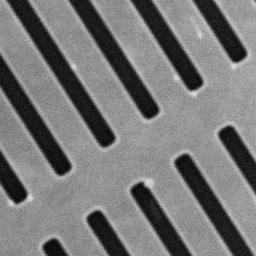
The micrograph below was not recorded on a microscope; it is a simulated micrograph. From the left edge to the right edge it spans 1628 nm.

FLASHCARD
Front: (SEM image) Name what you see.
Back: groups of lines, slits or small figures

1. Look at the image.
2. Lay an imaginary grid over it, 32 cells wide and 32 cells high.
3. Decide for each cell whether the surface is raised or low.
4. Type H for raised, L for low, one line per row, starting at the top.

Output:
HLLLHHHHHLLLHHHHLLLHHHHHLLLHHHHH
HHLLLHHHHLLLHHHHHLLLHHHHHLLLHHHH
HHLLLHHHHHLLLHHHHHLLLHHHHHLLHHHH
HHHLLLHHHHHLLLHHHHLLLHHHHHLLLHHH
HHHHLLLHHHHLLLHHHHHLLLHHHHHLLLHH
HHHHLLLHHHHHLLLHHHHHLLLHHHHLLLHH
HHHHHLLLHHHHHLLLHHHHLLLHHHHHLLLH
LHHHHLLLHHHHHLLLHHHHHLLLHHHHHLLH
LHHHHHLLLHHHHHLLLHHHHHLLLHHHHHHH
LLHHHHHLLLHHHHLLLHHHHHLLLHHHHHHH
LLLHHHHLLLHHHHHLLLHHHHHLLHHHHHHH
LLLHHHHHLLLHHHHHLLLHHHHHHHHHHHHH
HLLLHHHHHLLLHHHHLLLHHHHHHHHHHHHH
HHLLLHHHHLLLHHHHHLLLHHHHHHHHHHHH
HHLLLHHHHHLLLHHHHHLLHHHHHHHHHHHH
HHHLLLHHHHHLLLHHHHHHHHHHHHHHHHHH
HHHHLLHHHHHLLLHHHHHHHHHHHHHLLLHH
HHHHLLLHHHHHLLLHHHHHHHHHHHHLLLHH
HHHHHLLLHHHHHHHHHHHHHHHHHHHHLLLH
LHHHHLLLHHHHHHHHHHHHHHLLHHHHHLLL
LHHHHHLLLHHHHHHHHHHHHHLLLHHHHLLL
LLHHHHHLLHHHHHHHHHHHHHLLLHHHHHLL
LLLHHHHHHHHHHHHHHHHHHHHLLLHHHHHL
LLLHHHHHHHHHHHHHLLLHHHHLLLHHHHHL
HLLLHHHHHHHHHHHHLLLHHHHHLLLHHHHH
HHLHHHHHHHHHHHHHHLLLHHHHHLLLHHHH
HHHHHHHHHHHLLHHHHHLLLHHHHLLLHHHH
HHHHHHHHHHHLLLHHHHLLLHHHHHLLLHHH
HHHHHHHHHHHLLLHHHHHLLLHHHHHLLLHH
HHHHHHHHHHHHLLLHHHHHLLLHHHHLLLHH
HHHHHLLLHHHHHLLHHHHHLLLHHHHHLLLH
HHHHHLLLHHHHHLLLHHHHHLLLHHHHHLLL